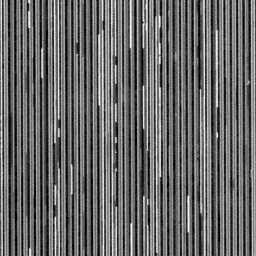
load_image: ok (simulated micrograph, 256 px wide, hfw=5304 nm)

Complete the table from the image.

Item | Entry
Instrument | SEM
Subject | parallel lines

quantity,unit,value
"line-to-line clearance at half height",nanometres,62.2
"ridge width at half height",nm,62.2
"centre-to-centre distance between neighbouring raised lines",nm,131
